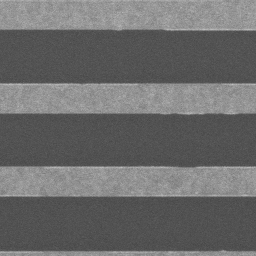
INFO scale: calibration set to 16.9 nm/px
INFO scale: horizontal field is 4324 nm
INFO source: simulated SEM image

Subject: lines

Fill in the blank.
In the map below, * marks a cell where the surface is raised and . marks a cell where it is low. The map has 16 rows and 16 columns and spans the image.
****************
****************
................
................
................
****************
****************
................
................
................
**********..****
****************
................
................
................
................